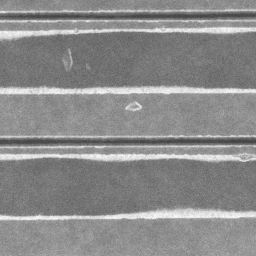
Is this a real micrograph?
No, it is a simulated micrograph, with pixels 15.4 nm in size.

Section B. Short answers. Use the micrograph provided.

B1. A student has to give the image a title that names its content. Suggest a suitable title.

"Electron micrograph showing lines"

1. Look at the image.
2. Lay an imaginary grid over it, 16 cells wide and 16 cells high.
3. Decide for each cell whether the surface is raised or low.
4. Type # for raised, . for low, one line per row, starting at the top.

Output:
################
################
................
................
................
................
################
################
################
################
................
................
................
...........#....
################
################